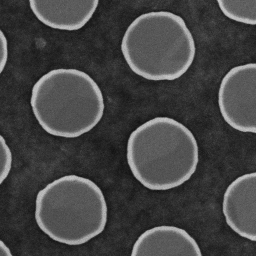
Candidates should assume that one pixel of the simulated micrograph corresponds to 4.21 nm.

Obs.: raised bodies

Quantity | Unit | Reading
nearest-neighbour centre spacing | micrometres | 0.452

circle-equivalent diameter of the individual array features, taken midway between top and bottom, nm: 282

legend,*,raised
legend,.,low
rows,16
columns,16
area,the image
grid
..****........**
...**...***.....
........****....
........****....
...**....**....*
..****........**
..****........**
..****........**
........****....
........****....
........****....
...***...**....*
..****........**
..*****.......**
...***...**....*
........****....